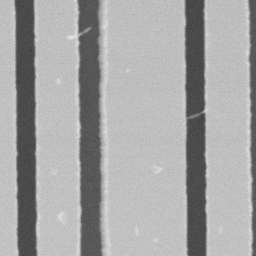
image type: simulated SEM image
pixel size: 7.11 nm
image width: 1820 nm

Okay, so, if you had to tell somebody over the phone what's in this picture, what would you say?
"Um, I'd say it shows lines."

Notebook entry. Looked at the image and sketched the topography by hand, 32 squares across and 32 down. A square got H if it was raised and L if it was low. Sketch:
HHLLHHHHHHLLLHHHHHHHHHHLLLHHHHHL
HHLLHHHHHHLLLHHHHHHHHHHLLLHHHHHL
HHLLHHHHHHLLLHHHHHHHHHHLLLHHHHHL
HHLLHHHHHHLLLHHHHHHHHHHLLLHHHHHL
HHLLHHHHHHLLLHHHHHHHHHHLLLHHHHHL
HHLLHHHHHHLLLHHHHHHHHHHLLLHHHHHL
HHLLHHHHHHLLLHHHHHHHHHHLLLHHHHHL
HHLLHHHHHHLLLHHHHHHHHHHLLLHHHHHL
HHLLHHHHHHLLLHHHHHHHHHHLLLHHHHHL
HHLLHHHHHHLLLHHHHHHHHHHLLLHHHHHL
HHLLHHHHHHLLLHHHHHHHHHHLLLHHHHHL
HHLLHHHHHHLLLHHHHHHHHHHLLLHHHHHL
HHLLHHHHHHLLLHHHHHHHHHHLLLHHHHHL
HHLLHHHHHHLLLHHHHHHHHHHLLLHHHHHL
HHLLHHHHHHLLLHHHHHHHHHHLLLHHHHHL
HHLLHHHHHHLLLHHHHHHHHHHLLLHHHHHL
HHLLHHHHHHLLLHHHHHHHHHHLLLHHHHHL
HHLLLHHHHHLLLHHHHHHHHHHLLLHHHHHL
HHLLHHHHHHLLLHHHHHHHHHHLLLHHHHHL
HHLLHHHHHHLLLHHHHHHHHHHLLLHHHHHL
HHLLLHHHHHLLLHHHHHHHHHHLLLHHHHHL
HHLLLHHHHHLLLHHHHHHHHHHLLLHHHHHL
HHLLHHHHHHLLLHHHHHHHHHHLLLHHHHHH
HHLLLHHHHHLLLHHHHHHHHHHLLLHHHHHL
HHLLLHHHHHLLLHHHHHHHHHHLLLHHHHHL
HHLLLHHHHHLLLHHHHHHHHHHLLLHHHHHH
HHLLLHHHHHLLLHHHHHHHHHHLLLHHHHHH
HHLLLHHHHHLLLHHHHHHHHHHLLLHHHHHL
HHLLLHHHHHLLLHHHHHHHHHHLLLHHHHHH
HHLLLHHHHHLLLHHHHHHHHHHLLLHHHHHH
HHLLLHHHHHLLLHHHHHHHHHHLLLHHHHHH
HHLLLHHHHHLLLHHHHHHHHHHLLLHHHHHH